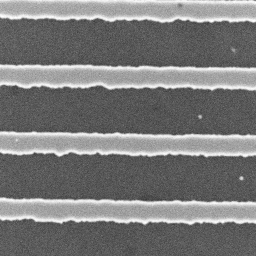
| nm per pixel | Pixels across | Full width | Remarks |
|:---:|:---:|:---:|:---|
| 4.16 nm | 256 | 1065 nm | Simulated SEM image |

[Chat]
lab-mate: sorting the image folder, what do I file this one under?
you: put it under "lines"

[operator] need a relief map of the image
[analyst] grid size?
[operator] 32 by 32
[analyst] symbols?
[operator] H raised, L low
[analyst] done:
HHHHHHHHHHHHHHHHHHHHHHHHHHHHHHHH
HHHHHHHHHHHHHHHHHHHHHHHHHHHHHHHH
LLLLLLLHLLLLLHHHHHLHHHLHHHHHHHHH
LLLLLLLLLLLLLLLLLLLLLLLLLLLLLLLL
LLLLLLLLLLLLLLLLLLLLLLLLLLLLLLLL
LLLLLLLLLLLLLLLLLLLLLLLLLLLLLLLL
LLLLLLLLLLLLLLLLLLLLLLLLLLLLLLLL
LLLLLLLLLLLLLLLLLLLLLLLLLLLLLLLL
HHHHHHHHHHHHHHHHHHHHHHHHHLHLLHLL
HHHHHHHHHHHHHHHHHHHHHHHHHHHHHHHH
HHHHHHHHHHHHHHHHHHHHHHHHHHHHHHHH
LLLLLLLLLLLLLLLLLLLLLLLLLLLLLLLL
LLLLLLLLLLLLLLLLLLLLLLLLLLLLLLLL
LLLLLLLLLLLLLLLLLLLLLLLLLLLLLLLL
LLLLLLLLLLLLLLLLLLLLLLLLLLLLLLLL
LLLLLLLLLLLLLLLLLLLLLLLLLLLLLLLL
LLLLLLLLLLLLLLLLLLLLLLLLLLLLLLLL
HHHHHHHHHHHHHHHHHHHHHHHHHHHHHHHH
HHHHHHHHHHHHHHHHHHHHHHHHHHHHHHHH
LLLLLLLLLLLLLLLLLLLLLLLLLLLLLLHL
LLLLLLLLLLLLLLLLLLLLLLLLLLLLLLLL
LLLLLLLLLLLLLLLLLLLLLLLLLLLLLLLL
LLLLLLLLLLLLLLLLLLLLLLLLLLLLLLLL
LLLLLLLLLLLLLLLLLLLLLLLLLLLLLLLL
LLLLLLLLLLLLLLLLLLLLLLLLLLLLLLLL
HHHHHHHHHHHHHHHHHHHHHHHHHHHHHHHH
HHHHHHHHHHHHHHHHHHHHHHHHHHHHHHHH
LLLLHHHHHHHHHHHHHHHHHHHHHHHHHHHH
LLLLLLLLLLLLLLLLLLLLLLLLLLLLLLLL
LLLLLLLLLLLLLLLLLLLLLLLLLLLLLLLL
LLLLLLLLLLLLLLLLLLLLLLLLLLLLLLLL
LLLLLLLLLLLLLLLLLLLLLLLLLLLLLLLL